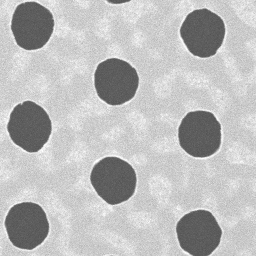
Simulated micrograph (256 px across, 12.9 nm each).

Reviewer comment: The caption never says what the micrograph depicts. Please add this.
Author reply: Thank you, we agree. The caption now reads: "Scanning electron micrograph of holes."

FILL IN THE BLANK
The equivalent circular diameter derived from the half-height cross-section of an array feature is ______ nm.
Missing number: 595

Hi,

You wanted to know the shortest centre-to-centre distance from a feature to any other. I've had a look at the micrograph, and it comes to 1.26 microns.